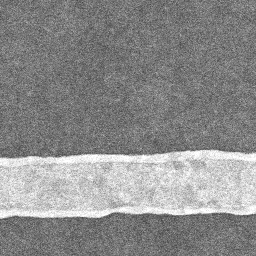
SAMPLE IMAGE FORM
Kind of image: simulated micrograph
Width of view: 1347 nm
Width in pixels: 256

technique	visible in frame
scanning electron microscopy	one or a few lines or trenches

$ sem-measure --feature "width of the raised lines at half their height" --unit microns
0.285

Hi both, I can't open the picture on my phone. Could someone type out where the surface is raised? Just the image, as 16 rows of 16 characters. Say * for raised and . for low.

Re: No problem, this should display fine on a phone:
................
................
................
................
................
................
................
................
................
................
****************
****************
****************
................
................
................